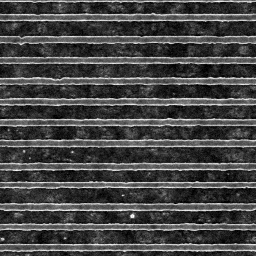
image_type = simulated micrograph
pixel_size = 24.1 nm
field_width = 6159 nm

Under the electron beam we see parallel lines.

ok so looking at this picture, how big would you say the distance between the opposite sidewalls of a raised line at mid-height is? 0.168 microns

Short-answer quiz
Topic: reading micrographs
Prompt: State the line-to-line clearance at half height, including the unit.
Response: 337 nm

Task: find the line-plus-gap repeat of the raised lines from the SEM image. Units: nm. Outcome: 504